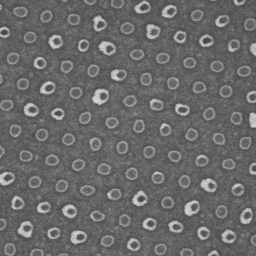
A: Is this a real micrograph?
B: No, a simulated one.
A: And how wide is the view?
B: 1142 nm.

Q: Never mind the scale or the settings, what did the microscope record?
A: a regular array of raised bodies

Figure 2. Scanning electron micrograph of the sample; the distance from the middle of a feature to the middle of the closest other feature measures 117 nm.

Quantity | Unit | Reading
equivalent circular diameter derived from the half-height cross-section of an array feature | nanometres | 52.6